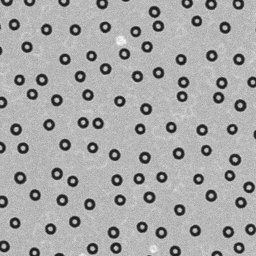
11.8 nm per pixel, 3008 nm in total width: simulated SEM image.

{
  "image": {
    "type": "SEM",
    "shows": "a regular array of ring-shaped grooves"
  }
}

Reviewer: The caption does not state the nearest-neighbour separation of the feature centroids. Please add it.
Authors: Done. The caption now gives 21.2 pixels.